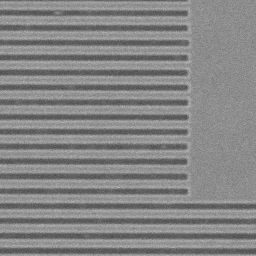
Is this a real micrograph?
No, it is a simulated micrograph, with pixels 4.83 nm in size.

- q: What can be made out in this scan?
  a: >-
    parallel lines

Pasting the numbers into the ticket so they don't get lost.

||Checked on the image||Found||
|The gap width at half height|38.1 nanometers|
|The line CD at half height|0.0381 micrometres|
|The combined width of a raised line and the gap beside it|71.5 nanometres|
